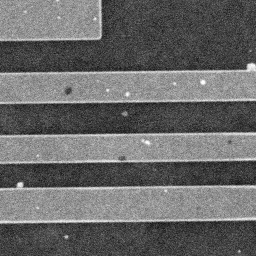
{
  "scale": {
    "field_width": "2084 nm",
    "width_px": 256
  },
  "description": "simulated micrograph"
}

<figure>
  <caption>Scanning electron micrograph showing groups of lines, slits or small figures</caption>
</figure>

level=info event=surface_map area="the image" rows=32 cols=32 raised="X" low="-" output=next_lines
XXXXXXXXXXXX--------------------
XXXXXXXXXXXXX-------------------
XXXXXXXXXXXXX-------------------
XXXXXXXXXXXXX-------------------
XXXXXXXXXXXXX-------------------
--------------------------------
--------------------------------
--------------------------------
-------------------------------X
XXXXXXXXXXXXXXXXXXXXXXXXXXXXXXXX
XXXXXXXXXXXXXXXXXXXXXXXXXXXXXXXX
XXXXXXXXXXXXXXXXXXXXXXXXXXXXXXXX
XXXXXXXXXXXXXXXXXXXXXXXXXXXXXX--
--------------------------------
--------------------------------
--------------------------------
--------------------------------
XXXXXXXXXXXXXXXXXXXXXXXXXXXXXXXX
XXXXXXXXXXXXXXXXXXXXXXXXXXXXXXXX
XXXXXXXXXXXXXXXXXXXXXXXXXXXXXXXX
--------------------------------
--------------------------------
--------------------------------
--X----------XXXXXXXXXXXXXXXXXXX
XXXXXXXXXXXXXXXXXXXXXXXXXXXXXXXX
XXXXXXXXXXXXXXXXXXXXXXXXXXXXXXXX
XXXXXXXXXXXXXXXXXXXXXXXXXXXXXXXX
XXXXXXXXXXXXXXXXXXXXXXXXXXXX----
--------------------------------
--------------------------------
--------------------------------
--------------------------------